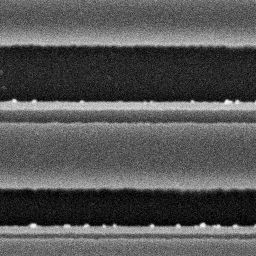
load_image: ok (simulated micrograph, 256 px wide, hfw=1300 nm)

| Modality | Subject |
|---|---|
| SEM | lines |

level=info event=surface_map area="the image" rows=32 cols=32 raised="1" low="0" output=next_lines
11111111111111111111111111111111
11111111111111111111111111111111
11111111111111111111111111111111
11111111111111111111111111111111
11111111111111111111111111111111
00000101000101010000101100001111
00000000000000000000000000000000
00000000000000000000000000000000
00000000000000000000000000000000
00000000000000000000000000000000
00000000000000000000000000000000
00000000000000000000000000000000
00000000000000000000000000000000
11111111111111111111111111111111
11111111111111111111111111111111
11111111111111111111111111111111
11111111111111111111111111111111
11111111111111111111111111111111
11111111111111111111111111111111
11111111111111111111111111111111
11111111111111111111111111111111
11111111111111111111111111111111
11111111111111111111111111111111
00001000000000000100001111101010
00000000000000000000000000000000
00000000000000000000000000000000
00000000000000000000000000000000
00000000000000000000000000000000
11111111111111111111111111111111
11111111111111111111111111111111
11111111111111111111111111111111
11111111111111111111111111111111